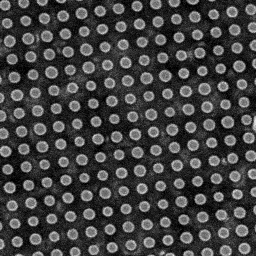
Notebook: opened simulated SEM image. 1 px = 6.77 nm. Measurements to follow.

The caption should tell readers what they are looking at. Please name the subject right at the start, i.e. a regular array of raised bodies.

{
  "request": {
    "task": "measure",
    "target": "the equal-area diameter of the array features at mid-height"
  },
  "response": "0.0696 µm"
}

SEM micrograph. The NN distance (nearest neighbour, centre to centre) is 122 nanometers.